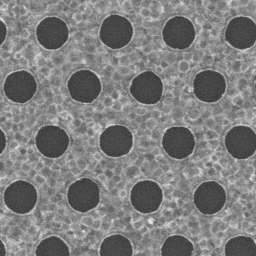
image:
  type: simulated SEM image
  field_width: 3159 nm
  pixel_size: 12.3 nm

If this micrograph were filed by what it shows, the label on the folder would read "a regular array of holes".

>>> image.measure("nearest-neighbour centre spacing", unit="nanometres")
769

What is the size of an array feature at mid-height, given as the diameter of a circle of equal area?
0.415 micrometres